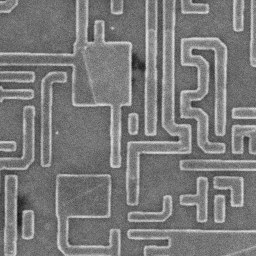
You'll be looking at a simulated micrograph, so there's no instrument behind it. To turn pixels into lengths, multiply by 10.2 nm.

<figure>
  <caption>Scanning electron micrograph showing wiring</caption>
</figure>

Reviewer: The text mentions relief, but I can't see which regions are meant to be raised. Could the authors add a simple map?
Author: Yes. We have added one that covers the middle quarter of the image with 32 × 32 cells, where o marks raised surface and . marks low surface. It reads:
..ooooooooooooooo....oo..oo.....
...oooooooooooooo....oo..oo.....
o.ooooooooooooooo....oo..oo.....
o.ooooooooooooooo....oo..oo.....
..ooooooooooooooo....oo..oo.....
..ooooooooooooooo....oo..oo.....
..ooooooooooooooo....oo..oo.....
..ooooooooooooooo....oo..oo..ooo
..ooooooooooooooo....oo..oo..ooo
..ooooooooooooooo....oo..oo..ooo
............ooo......oo..oo..ooo
............oo.......oo..oo..ooo
............oo.......oo..oo..ooo
............oo..oo...oo..oo.....
............oo..oo...oo..ooo....
............oo..oo...oo..ooooooo
............oo..oo...oo...oooooo
............oo.......oo....ooooo
............oo...............ooo
............oo..............oooo
............oo..oooooooooooooooo
............oo..oooooooooooooooo
............oo..ooo.............
............oo..ooo.............
............oo..ooo..........ooo
............oo..ooo..........ooo
................ooo.............
................ooo.............
oooooooooooo....ooo.............
oooooooooooo....ooo.............
oooooooooooo....ooo.............
oooooooooooo....ooo.............